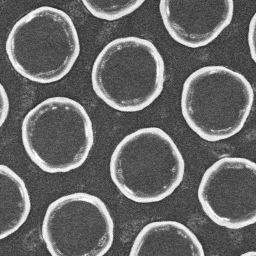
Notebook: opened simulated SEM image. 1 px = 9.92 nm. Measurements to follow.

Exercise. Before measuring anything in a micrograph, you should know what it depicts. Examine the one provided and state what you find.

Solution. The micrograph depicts raised bodies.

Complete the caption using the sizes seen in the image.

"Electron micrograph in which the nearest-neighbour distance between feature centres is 898 nm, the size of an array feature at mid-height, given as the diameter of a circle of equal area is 687 nm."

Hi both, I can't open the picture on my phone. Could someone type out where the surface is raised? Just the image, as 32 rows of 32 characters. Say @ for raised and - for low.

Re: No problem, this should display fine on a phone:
-----------@@@@@@---@@@@@@@@@---
----@@@-----@@@@----@@@@@@@@@---
---@@@@@@------------@@@@@@@@---
--@@@@@@@------------@@@@@@@---@
-@@@@@@@@-------------@@@@@----@
-@@@@@@@@@----@@@@@----@@------@
-@@@@@@@@@---@@@@@@-------------
-@@@@@@@@---@@@@@@@@------------
--@@@@@@@---@@@@@@@@-------@----
---@@@@@----@@@@@@@@----@@@@@@--
------------@@@@@@@@---@@@@@@@@-
------------@@@@@@@@---@@@@@@@@-
@------@-----@@@@@@----@@@@@@@@-
@----@@@@@-----@@------@@@@@@@@-
---@@@@@@@@------------@@@@@@@@-
---@@@@@@@@-------------@@@@@@--
---@@@@@@@@------@@@-----@@@@---
---@@@@@@@@-----@@@@@-----------
---@@@@@@@@----@@@@@@@----------
----@@@@@@@---@@@@@@@@----------
-----@@@@@----@@@@@@@@@----@@@@-
@-------------@@@@@@@@@---@@@@@@
@@------------@@@@@@@@----@@@@@@
@@@------------@@@@@@@---@@@@@@@
@@@------@@-----@@@@-----@@@@@@@
@@@----@@@@@@------------@@@@@@@
@@@---@@@@@@@-------------@@@@@@
@@@---@@@@@@@@-------------@@@@@
@@----@@@@@@@@----@@@@@---------
------@@@@@@@@----@@@@@@--------
------@@@@@@@@---@@@@@@@@-------
-------@@@@@@----@@@@@@@@-------